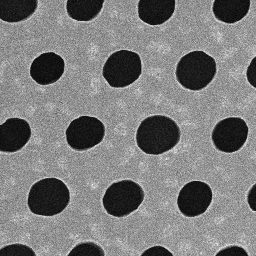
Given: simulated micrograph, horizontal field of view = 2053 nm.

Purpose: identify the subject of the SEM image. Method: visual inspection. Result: a regular array of holes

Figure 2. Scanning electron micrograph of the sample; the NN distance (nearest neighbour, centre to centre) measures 0.583 micrometres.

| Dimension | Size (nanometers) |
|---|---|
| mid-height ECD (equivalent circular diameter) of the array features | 300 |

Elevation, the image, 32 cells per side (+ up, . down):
.....+++.....++++.....+++++....+
....++++....+++++.....+++++....+
...++++++..+++++++...+++++++..++
++++++++++++++++++++++++++++++++
++++++++++++++++++++++++++++++++
++++++++++++++++++++++++++++++++
+++++++++++++++..+++++++.+++++++
++++....+++++.....+++++....+++++
++++....+++++.....++++.....++++.
++++....+++++....+++++.....++++.
+++++.++++++++..+++++++...+++++.
++++++++++++++++++++++++++++++++
++++++++++++++++++++++++++++++++
++++++++++++++++++++++++++++++++
++++++++++.++++++++..+++++++++++
...++++++....+++++....+++++....+
....++++.....++++.....+++++....+
....++++.....++++.....+++++....+
...++++++..+++++++....+++++...++
++++++++++++++++++++++++++++++++
++++++++++++++++++++++++++++++++
++++++++++++++++++++++++++++++++
+++++..+++++++++++++++++++++++++
++++....++++++....+++++...++++++
++++.....++++.....++++.....++++.
+++.....+++++.....++++....+++++.
++++...++++++...+++++++..+++++++
++++++++++++++++++++++++++++++++
++++++++++++++++++++++++++++++++
++++++++++++++++++++++++++++++++
++++++++++..++++++++++++++++++++
....+++++....+++++...++++++....+